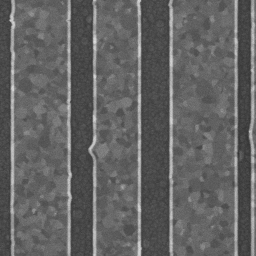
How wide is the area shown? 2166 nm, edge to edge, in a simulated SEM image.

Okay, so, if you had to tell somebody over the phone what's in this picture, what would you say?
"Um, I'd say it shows one or a few lines or trenches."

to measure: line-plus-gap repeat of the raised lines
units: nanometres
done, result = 691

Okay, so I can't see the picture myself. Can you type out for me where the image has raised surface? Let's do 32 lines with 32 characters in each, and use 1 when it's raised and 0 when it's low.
00111111100011111000011111111000
00111111100011111000001111111000
00111111100011111000011111111000
00111111100011111000011111111000
00111111100011111000001111111000
00111111100011111000001111111100
00111111100011111000001111111000
00111111100011111000001111111000
00111111100011111000001111111000
00111111100011111000001111111100
00111111100011111000001111111100
00111111100011111000001111111000
00111111100011111000001111111000
00111111100011111000001111111000
00111111100011111000001111111000
00111111100011111000001111111101
00111111100011111000001111111101
00111111100011111000011111111101
00111111100111111000011111111000
00111111100011111000011111111000
00111111100011111000001111111000
00111111100011111000011111111000
00111111100011111000011111111000
00111111100011111000001111111000
00111111100011111000001111111000
00111111100011111000001111111000
00111111100011111000001111111100
00111111100011111000001111111100
00111111100011111000001111111000
00111111100011111000001111111000
00111111100011111000001111111000
00111111100011111000001111111000